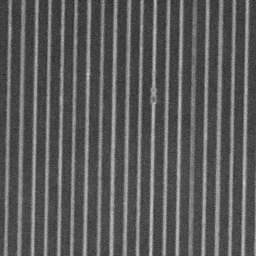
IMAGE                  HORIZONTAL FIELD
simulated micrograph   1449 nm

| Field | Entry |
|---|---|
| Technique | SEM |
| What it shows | parallel lines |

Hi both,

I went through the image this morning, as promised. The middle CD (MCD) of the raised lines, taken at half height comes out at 14.9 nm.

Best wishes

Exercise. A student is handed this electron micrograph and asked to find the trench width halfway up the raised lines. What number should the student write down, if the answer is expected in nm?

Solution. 61.6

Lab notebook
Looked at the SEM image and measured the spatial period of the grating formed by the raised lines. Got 74.5 nanometers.